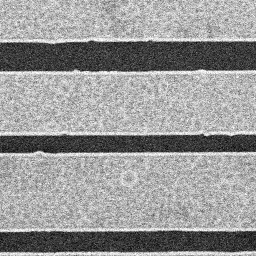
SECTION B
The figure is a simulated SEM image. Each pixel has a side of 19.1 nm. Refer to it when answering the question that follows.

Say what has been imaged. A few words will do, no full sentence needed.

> one or a few lines or trenches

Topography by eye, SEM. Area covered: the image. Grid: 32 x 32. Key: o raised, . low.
oooooooooooooooooooooooooooooooo
oooooooooooooooooooooooooooooooo
oooooooooooooooooooooooooooooooo
oooooooooooooooooooooooooooooooo
oooooooooooooooooooooooooooooooo
................................
................................
................................
................................
oooooooooooooooooooooooooooooooo
oooooooooooooooooooooooooooooooo
oooooooooooooooooooooooooooooooo
oooooooooooooooooooooooooooooooo
oooooooooooooooooooooooooooooooo
oooooooooooooooooooooooooooooooo
oooooooooooooooooooooooooooooooo
ooooooooooooooooooooooooooo.oo..
................................
................................
oooooooooooooooooooooooooooooooo
oooooooooooooooooooooooooooooooo
oooooooooooooooooooooooooooooooo
oooooooooooooooooooooooooooooooo
oooooooooooooooooooooooooooooooo
oooooooooooooooooooooooooooooooo
oooooooooooooooooooooooooooooooo
oooooooooooooooooooooooooooooooo
oooooooooooooooooooooooooooooooo
oooooooooooooooooooooooooooooooo
................................
................................
................................